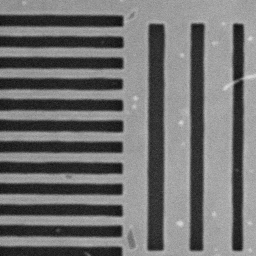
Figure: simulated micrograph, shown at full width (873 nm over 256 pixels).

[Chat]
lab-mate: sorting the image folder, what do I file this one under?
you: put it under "groups of lines, slits or small figures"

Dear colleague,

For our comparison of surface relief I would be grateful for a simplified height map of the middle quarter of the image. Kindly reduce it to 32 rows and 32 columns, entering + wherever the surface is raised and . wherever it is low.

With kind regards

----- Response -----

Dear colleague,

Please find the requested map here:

...............++++++....++++++.
+++++++...+++++++++++....++++++.
+++++++++++++++++++++....++++++.
++++++.....++++++++++....++++++.
...............++++++....++++++.
...............++++++....++++++.
..............+++++++....++++++.
+++++++++++++++++++++....++++++.
+++++++++++++++++++++....++++++.
...............++++++....++++++.
...............++++++....++++++.
...............++++++....++++++.
+++++++++++++++++++++....++++++.
+++++++++++++++++++++....++++++.
...............++++++....++++++.
...............++++++....++++++.
...............++++++....++++++.
+++++++++++++++++++++....++++++.
+++++++++++++++++++++....++++++.
...............++++++....++++++.
...............++++++....++++++.
...............++++++....++++++.
+++++++++++++++++++++....++++++.
+++++++++++++++++++++....++++++.
..........+++++++++++....++++++.
...............++++++....++++++.
...............++++++....++++++.
..............+++++++....++++++.
+++++++++++++++++++++....++++++.
+++++++++++++++++++++....++++++.
...............++++++....++++++.
...............++++++....++++++.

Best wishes